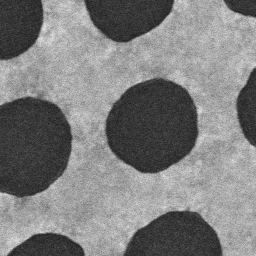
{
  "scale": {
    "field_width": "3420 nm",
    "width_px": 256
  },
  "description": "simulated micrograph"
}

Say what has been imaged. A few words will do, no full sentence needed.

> holes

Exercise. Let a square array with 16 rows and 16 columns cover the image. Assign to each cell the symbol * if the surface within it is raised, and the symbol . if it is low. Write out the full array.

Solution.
...**......***..
...***....******
..*****.********
.***************
****************
********...****.
...****.....***.
....***.....***.
....***.....***.
....***.....****
....****..******
...*************
****************
**********..****
*********....***
*....***......**